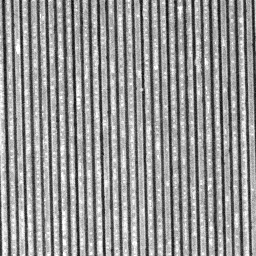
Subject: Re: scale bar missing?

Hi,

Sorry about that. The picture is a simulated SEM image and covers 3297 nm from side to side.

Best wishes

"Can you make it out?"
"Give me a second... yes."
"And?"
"parallel lines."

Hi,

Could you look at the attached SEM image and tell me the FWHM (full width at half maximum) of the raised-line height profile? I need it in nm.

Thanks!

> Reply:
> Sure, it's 64.4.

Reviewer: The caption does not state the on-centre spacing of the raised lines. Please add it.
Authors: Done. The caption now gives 111 nm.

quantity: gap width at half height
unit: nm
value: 49.9